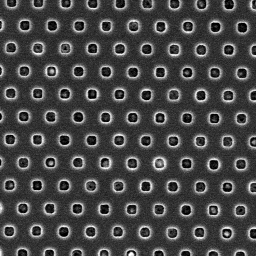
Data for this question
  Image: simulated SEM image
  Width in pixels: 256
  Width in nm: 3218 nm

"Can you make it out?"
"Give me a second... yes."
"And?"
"a regular array of holes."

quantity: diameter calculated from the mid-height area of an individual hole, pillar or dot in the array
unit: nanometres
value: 133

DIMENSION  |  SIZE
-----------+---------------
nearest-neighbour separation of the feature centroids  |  0.33 µm